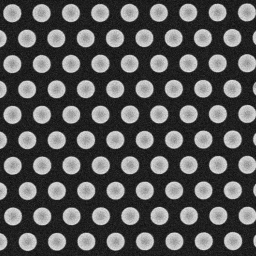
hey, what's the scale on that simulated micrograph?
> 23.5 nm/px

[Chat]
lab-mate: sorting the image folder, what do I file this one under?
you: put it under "an array of small figures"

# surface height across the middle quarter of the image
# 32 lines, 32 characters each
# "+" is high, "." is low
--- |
++++...++++...++++....++++...+++
+++.....+++....+++....+++.....++
................................
................................
....+++.....++.....++.....+++...
...++++....++++...++++...+++++..
...+++++...++++...++++...+++++..
....+++....++++...++++....+++...
................................
................................
...............................+
++++...++++....+++....++++...+++
++++...++++...+++++...++++...+++
++++...++++...++++....++++...+++
.++.....++.....+++.....++.....++
................................
................................
....+++....+++.....+++....+++...
...+++++...++++...++++...+++++..
...+++++...++++...++++...+++++..
....+++....+++.....+++....+++...
................................
................................
.++.....++.....+++.....++.....++
++++...++++...+++++...++++...+++
++++...++++...+++++...++++...+++
++++...++++....+++....++++...+++
................................
................................
...........................+....
....+++....++++...++++....+++...
...+++++...++++...++++...+++++..